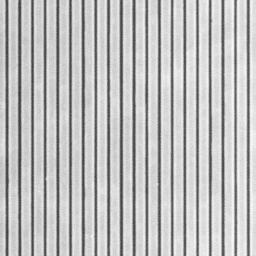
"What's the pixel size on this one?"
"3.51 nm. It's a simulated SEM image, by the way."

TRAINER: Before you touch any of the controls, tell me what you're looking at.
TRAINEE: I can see parallel lines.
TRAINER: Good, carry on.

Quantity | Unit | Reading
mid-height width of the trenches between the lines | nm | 13.6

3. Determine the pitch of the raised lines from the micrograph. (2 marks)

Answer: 0.0445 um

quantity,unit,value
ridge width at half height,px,8.75